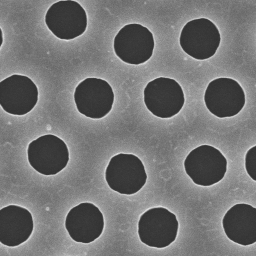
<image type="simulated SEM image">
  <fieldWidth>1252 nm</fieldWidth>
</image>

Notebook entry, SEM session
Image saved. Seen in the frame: a regular array of holes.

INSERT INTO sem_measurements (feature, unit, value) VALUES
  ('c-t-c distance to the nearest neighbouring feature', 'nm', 310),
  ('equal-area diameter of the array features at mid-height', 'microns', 0.199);